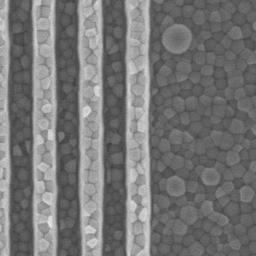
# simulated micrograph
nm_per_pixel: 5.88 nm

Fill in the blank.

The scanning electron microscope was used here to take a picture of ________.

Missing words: parallel lines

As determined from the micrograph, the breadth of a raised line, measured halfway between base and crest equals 126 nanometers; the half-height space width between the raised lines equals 148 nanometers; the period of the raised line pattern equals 274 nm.